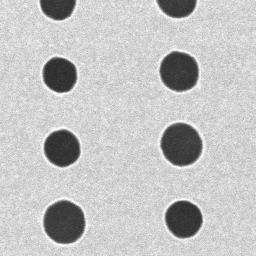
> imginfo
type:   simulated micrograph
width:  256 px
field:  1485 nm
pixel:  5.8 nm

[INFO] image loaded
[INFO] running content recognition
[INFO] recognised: holes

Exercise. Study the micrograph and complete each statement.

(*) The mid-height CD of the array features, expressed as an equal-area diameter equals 223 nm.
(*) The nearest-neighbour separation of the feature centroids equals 426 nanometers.